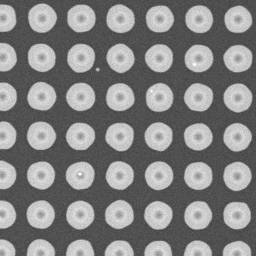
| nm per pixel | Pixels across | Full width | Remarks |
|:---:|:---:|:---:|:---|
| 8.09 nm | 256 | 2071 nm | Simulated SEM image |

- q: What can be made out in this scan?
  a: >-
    an array of small figures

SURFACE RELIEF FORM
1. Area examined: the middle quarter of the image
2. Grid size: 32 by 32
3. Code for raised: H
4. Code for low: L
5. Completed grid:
LHHHHHHLLLLHHHHHHLLLLHHHHHHLLLLH
LLHHHHLLLLLLHHHHLLLLLLHHHHLLLLLL
LLLLLLLLLLLLLLLLLLLLLLLLLLLLLLLL
LLLLLLLLLLLLLLLLLLLLLLLLLLLLLLLL
LLLLLLLLLLLLLLLLLLLLLLLLLLLLLLLL
LLHHHHLLLLLLHHHHLLLLLLHHHHLLLLLL
LHHHHHHLLLLHHHHHHLLLLHHHHHHLLLLH
LHHHHHHHLLLHHHHHHLLLLHHHHHHLLLHH
LHHHHHHHLLLHHHHHHHLLLHHHHHHLLLHH
LHHHHHHHLLLHHHHHHLLLLHHHHHHLLLHH
LHHHHHHLLLLHHHHHHLLLLHHHHHHLLLLH
LLLHHLLLLLLLLHHLLLLLLLHHHLLLLLLL
LLLLLLLLLLLLLLLLLLLLLLLLLLLLLLLL
LLLLLLLLLLLLLLLLLLLLLLLLLLLLLLLL
LLLLLLLLLLLLLLLLLLLLLLLLLLLLLLLL
LLHHHHLLLLLLHHHHLLLLLHHHHHLLLLLL
LHHHHHHLLLLHHHHHHLLLLHHHHHHLLLHH
LHHHHHHHLLHHHHHHHLLLHHHHHHHLLLHH
LHHHHHHHLLHHHHHHHLLLHHHHHHHLLLHH
LHHHHHHLLLLHHHHHHLLLHHHHHHHLLLHH
LLHHHHLLLLLLHHHHHLLLLHHHHHLLLLLH
LLLLLLLLLLLLLHHHLLLLLLLHHLLLLLLL
LLLLLLLLLLLLLLLLLLLLLLLLLLLLLLLL
LLLLLLLLLLLLLLLLLLLLLLLLLLLLLLLL
LLLLHLLLLLLLLHHLLLLLLLLHHLLLLLLL
LLHHHHHLLLLHHHHHHLLLLHHHHHLLLLLH
LHHHHHHLLLLHHHHHHLLLLHHHHHHLLLHH
HHHHHHHHLLLHHHHHHLLLHHHHHHHLLLHH
LHHHHHHLLLLHHHHHHLLLHHHHHHHLLLHH
LHHHHHHLLLLHHHHHHLLLLHHHHHHLLLHH
LLHHHHLLLLLLHHHHLLLLLHHHHHLLLLLH
LLLLLLLLLLLLLLLLLLLLLLLLLLLLLLLL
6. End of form